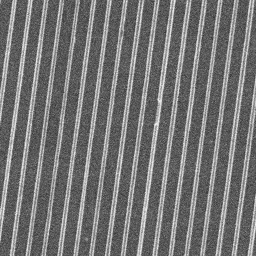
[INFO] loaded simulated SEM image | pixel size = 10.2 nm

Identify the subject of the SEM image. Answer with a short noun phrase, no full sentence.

parallel lines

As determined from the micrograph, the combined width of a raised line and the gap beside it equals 160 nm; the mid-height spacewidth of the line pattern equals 121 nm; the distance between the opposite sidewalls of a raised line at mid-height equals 36.6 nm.